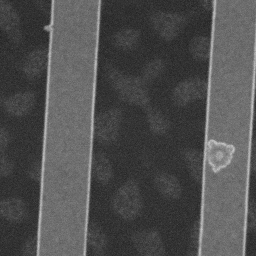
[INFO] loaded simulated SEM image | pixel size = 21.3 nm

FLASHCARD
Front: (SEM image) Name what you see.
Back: one or a few lines or trenches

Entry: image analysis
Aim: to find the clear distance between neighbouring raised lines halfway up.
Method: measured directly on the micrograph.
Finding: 2430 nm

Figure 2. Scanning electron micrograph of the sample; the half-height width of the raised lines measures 982 nanometers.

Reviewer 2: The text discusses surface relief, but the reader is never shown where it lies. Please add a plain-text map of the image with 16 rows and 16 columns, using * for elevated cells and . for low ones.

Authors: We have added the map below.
...***.......***
...***.......***
...***.......***
...***.......***
...***.......***
...***.......***
...***.......***
...***.......***
...***.......***
...***.......***
...***.......***
...***.......**.
...***.......**.
..***........**.
..***........**.
..***.......***.